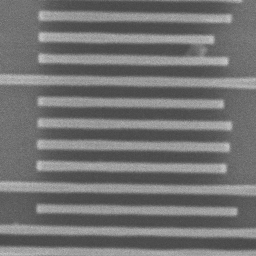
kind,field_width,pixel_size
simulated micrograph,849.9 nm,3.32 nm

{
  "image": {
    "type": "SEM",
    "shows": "groups of lines, slits or small figures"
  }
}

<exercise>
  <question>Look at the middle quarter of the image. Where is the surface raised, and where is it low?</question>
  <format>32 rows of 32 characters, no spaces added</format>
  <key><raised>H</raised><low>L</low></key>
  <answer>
LLLLLLLLLLLLLLLLLLLLLLLLLLLLLLLL
LLLLLLLLLLLLLLLLLLLLLLLLLLLLLLLL
LLLLLLLLLLLLLLLLLLLLLLLLLLLLLLLL
HHHHHHHHHHHHHHHHHHHHHHHHHHHHLLLL
HHHHHHHHHHHHHHHHHHHHHHHHHHHHHHHH
LLLLLLLLLLLLLLLLLLLLLLLLLLLLLLHH
LLLLLLLLLLLLLLLLLLLLLLLLLLLLLLLL
LLLLLLLLLLLLLLLLLLLLLLLLLLLLLLLL
LLLLLLLLLLLLLLLLLLLLLLLLLLLLLLLL
HHHHHHHHHHHHHHHHHHHHHHHHHHHHHHHH
HHHHHHHHHHHHHHHHHHHHHHHHHHHHHHHH
LLLLLLLLLLLLLLLLLLLLLLLLLLLLLLLL
LLLLLLLLLLLLLLLLLLLLLLLLLLLLLLLL
LLLLLLLLLLLLLLLLLLLLLLLLLLLLLLLL
HHHHHHHHHHHHHHHHHHHHHHHHHHHHHHHH
HHHHHHHHHHHHHHHHHHHHHHHHHHHHHHHH
LLLLLLLLLLLLLLLLLLLLLLLLLLLLLLLL
LLLLLLLLLLLLLLLLLLLLLLLLLLLLLLLL
LLLLLLLLLLLLLLLLLLLLLLLLLLLLLLLL
HHHHHHHHHHHHHLLLLLLLLLLLLLLLLLLL
HHHHHHHHHHHHHHHHHHHHHHHHHHHHHHHH
LLLLLLLLLLLLLLLLHHHHHHHHHHHHHHHH
LLLLLLLLLLLLLLLLLLLLLLLLLLLLLLLL
LLLLLLLLLLLLLLLLLLLLLLLLLLLLLLLL
HHLLLLLLLLLLLLLLLLLLLLLLLLLLLLLL
HHHHHHHHHHHHHHHHHHHHHHHHHHHHHHHH
HHHLLLHHHHHHHHHHHHHHHHHHHHHHHHHH
LLLLLLLLLLLLLLLLLLLLLLLLLLLLLLLL
LLLLLLLLLLLLLLLLLLLLLLLLLLLLLLLL
LLLLLLLLLLLLLLLLLLLLLLLLLLLLLLLL
HHHHHHHHHHHHHHHHHHHHHHHHHHHHHHHH
HHHHHHHHHHHHHHHHHHHHHHHHHHHHHHHH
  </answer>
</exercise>